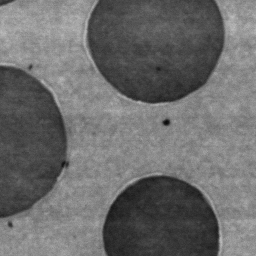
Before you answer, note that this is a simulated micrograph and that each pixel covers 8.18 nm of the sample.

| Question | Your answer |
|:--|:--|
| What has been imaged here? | holes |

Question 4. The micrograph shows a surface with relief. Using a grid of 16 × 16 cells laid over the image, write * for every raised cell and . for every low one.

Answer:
******........**
*****.........**
*****.........**
******........**
..****.......***
...****......***
....************
....************
....************
....************
....************
...*****....****
...****......***
.******......***
******........**
*******.......**